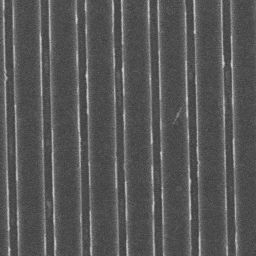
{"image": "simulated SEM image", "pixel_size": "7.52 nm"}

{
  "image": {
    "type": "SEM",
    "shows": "parallel lines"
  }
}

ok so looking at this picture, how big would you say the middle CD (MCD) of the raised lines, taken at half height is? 214 nm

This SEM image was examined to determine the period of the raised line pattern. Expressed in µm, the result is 0.273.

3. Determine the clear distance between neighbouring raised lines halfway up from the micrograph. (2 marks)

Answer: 0.0629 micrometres